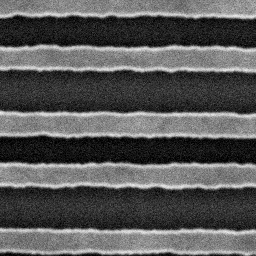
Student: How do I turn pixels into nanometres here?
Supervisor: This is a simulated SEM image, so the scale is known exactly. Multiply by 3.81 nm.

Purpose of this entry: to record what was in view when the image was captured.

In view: lines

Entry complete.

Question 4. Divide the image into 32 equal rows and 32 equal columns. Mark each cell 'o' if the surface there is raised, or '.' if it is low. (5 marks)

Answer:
oooooooooooooooooooooooooooooooo
oooooooooooooooooooooooooooooooo
................................
................................
................................
................................
oooooooooooooooooooooooooooooooo
oooooooooooooooooooooooooooooooo
oooooooooooooooooooooooooooooooo
................................
................................
................................
................................
................................
oooooooooooooooooooooooooooooooo
oooooooooooooooooooooooooooooooo
oooooooooooooooooooooooooooooooo
................................
................................
................................
ooo.........oooo.....o..o.......
oooooooooooooooooooooooooooooooo
oooooooooooooooooooooooooooooooo
.....................o....o.....
................................
................................
................................
................................
................................
oooooooooooooooooooooooooooooooo
oooooooooooooooooooooooooooooooo
oooooooooooooooooooooooooooooooo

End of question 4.